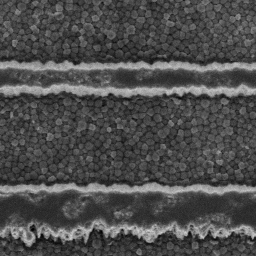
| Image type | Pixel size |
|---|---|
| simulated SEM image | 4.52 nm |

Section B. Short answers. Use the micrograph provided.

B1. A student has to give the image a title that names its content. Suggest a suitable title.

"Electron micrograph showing one or a few lines or trenches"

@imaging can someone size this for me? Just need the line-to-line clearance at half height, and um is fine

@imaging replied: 0.432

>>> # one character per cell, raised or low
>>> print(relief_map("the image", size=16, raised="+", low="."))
................
................
................
................
++++++++++++++++
++++++++++++++++
................
................
................
................
................
................
++++++++++++++++
++++++++++++++++
+++++...++.+++++
................